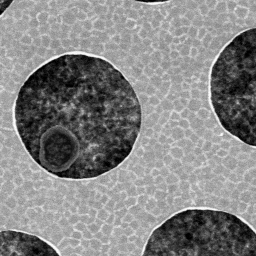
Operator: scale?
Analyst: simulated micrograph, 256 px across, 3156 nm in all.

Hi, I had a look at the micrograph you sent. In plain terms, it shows holes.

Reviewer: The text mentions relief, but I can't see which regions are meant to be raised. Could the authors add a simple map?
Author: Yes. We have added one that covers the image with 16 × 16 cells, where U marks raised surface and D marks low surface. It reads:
UUUUUUUUUUUUUUUU
UUUUUUUUUUUUUUUU
UUUUUUUUUUUUUUDD
UUUUDDUUUUUUUUDD
UUDDDDDUUUUUUDDD
UDDDDDDDUUUUUDDD
UDDDDDDDDUUUUDDD
UDDDDDDDDUUUUUDD
UDDUDDDDDUUUUUUD
UUDUUDDDUUUUUUUU
UUUUDDDUUUUUUUUU
UUUUUUUUUUUUUUUU
UUUUUUUUUUUUUUUU
UUUUUUUUUUUDDDDU
DUUUUUUUUUDDDDDD
DDDUUUUUUDDDDDDD